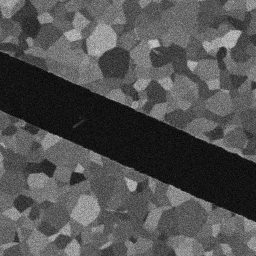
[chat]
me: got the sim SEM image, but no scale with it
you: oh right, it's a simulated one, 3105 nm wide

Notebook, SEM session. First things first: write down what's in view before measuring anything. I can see one or a few lines or trenches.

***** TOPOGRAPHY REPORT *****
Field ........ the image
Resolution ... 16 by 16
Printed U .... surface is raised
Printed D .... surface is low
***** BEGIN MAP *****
UUUUUUUUUUUUUUUU
UUUUUUUUUUUUUUUU
UUUUUUUUUUUUUUUU
DUUUUUUUUUUUUUUU
DDDUUUUUUUUUUUUU
DDDDDUUUUUUUUUUU
DDDDDDDDUUUUUUUU
UDDDDDDDDDUUUUUU
UUUUDDDDDDDDUUUU
UUUUUUDDDDDDDDDU
UUUUUUUUDDDDDDDD
UUUUUUUUUUDDDDDD
UUUUUUUUUUUUUDDD
UUUUUUUUUUUUUUUD
UUUUUUUUUUUUUUUU
UUUUUUUUUUUUUUUU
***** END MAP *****